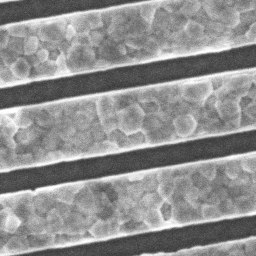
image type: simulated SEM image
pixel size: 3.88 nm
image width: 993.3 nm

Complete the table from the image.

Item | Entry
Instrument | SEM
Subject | one or a few lines or trenches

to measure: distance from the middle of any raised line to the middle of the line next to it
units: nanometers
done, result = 325